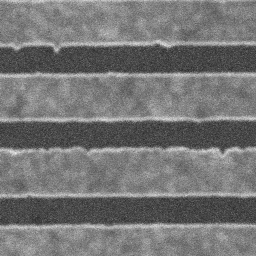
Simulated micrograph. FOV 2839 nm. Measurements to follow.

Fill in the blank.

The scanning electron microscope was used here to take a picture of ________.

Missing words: one or a few lines or trenches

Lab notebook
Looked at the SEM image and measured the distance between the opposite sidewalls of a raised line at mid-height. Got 0.491 microns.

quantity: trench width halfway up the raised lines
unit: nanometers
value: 340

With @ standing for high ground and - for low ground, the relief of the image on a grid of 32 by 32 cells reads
@@@@@@@@@@@@@@@@@@@@@@@@@@@@@@@@
@@@@@@@@@@@@@@@@@@@@@@@@@@@@@@@@
@@@@@@@@@@@@@@@@@@@@@@@@@@@@@@@@
@@@@@@@@@@@@@@@@@@@@@@@@@@@@@@@@
@@@@@@@@@@@@@@@@@@@@@@@@@@@@@@@@
@@@@--@@@-----------@@----------
--------------------------------
--------------------------------
--------------------------------
@-@@@@@---@@@@@@@-@@@@@@@@@@@@@@
@@@@@@@@@@@@@@@@@@@@@@@@@@@@@@@@
@@@@@@@@@@@@@@@@@@@@@@@@@@@@@@@@
@@@@@@@@@@@@@@@@@@@@@@@@@@@@@@@@
@@@@@@@@@@@@@@@@@@@@@@@@@@@@@@@@
@@@@@@@@@@@@@@@@@@@@@@@@@@@@@@@@
--------------------------------
--------------------------------
--------------------------------
--------------------------------
@@@@@@@@@@@@@@@@@@@@@@@@@@@@@@@@
@@@@@@@@@@@@@@@@@@@@@@@@@@@@@@@@
@@@@@@@@@@@@@@@@@@@@@@@@@@@@@@@@
@@@@@@@@@@@@@@@@@@@@@@@@@@@@@@@@
@@@@@@@@@@@@@@@@@@@@@@@@@@@@@@@@
--------------------------------
--------------------------------
--------------------------------
--------------------------------
-@@@@@@@@@@@@@@@@@@@@@@@@@@@@@@@
@@@@@@@@@@@@@@@@@@@@@@@@@@@@@@@@
@@@@@@@@@@@@@@@@@@@@@@@@@@@@@@@@
@@@@@@@@@@@@@@@@@@@@@@@@@@@@@@@@